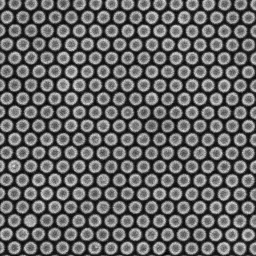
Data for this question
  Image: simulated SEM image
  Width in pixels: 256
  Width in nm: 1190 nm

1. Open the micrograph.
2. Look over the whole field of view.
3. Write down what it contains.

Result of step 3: a regular array of raised bodies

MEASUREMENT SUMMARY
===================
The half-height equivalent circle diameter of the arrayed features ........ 57.3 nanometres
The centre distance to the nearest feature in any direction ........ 71.9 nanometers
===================